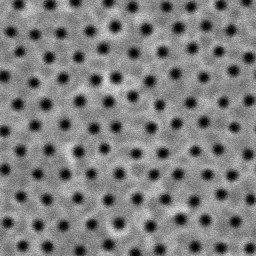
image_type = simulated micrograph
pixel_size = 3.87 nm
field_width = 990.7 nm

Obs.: a regular array of holes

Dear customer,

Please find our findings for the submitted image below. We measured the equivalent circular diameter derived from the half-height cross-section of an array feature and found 43.2 nm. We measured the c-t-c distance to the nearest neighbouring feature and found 95.8 nanometers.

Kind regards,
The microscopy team